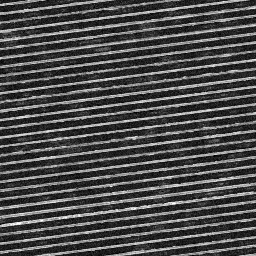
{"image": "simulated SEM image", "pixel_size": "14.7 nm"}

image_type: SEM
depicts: parallel lines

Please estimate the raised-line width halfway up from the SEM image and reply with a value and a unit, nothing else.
25.5 nm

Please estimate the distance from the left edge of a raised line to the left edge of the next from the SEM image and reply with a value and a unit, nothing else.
0.129 micrometres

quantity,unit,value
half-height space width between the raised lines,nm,98.5